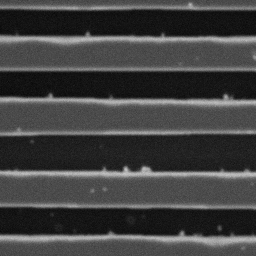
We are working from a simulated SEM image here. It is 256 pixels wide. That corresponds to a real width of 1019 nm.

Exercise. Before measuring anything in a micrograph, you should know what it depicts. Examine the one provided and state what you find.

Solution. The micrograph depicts lines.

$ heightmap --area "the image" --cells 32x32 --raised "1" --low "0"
11111111111111111111111111111111
00000000000000000000000000000000
00000000000000000000000000000000
00000000000000000000000000000000
00000000000000000000000000000000
11111111111111111111111111111111
11111111111111111111111111111111
11111111111111111111111111111111
11111111111111111111111111111111
00000000000000000000000000000000
00000000000000000000000000000000
00000000000000000000000000000000
11111111111111000000000000000000
11111111111111111111111111111111
11111111111111111111111111111111
11111111111111111111111111111111
11111111111111111111111111111111
00000000000000000000000000000000
00000000000000000000000000000000
00000000000000000000000000000000
00000000000000000000000000000000
11111100101110000000000000000000
11111111111111111111111111111111
11111111111111111111111111111111
11111111111111111111111111111111
11111111111111111111111111111111
00000000000000000000000000000000
00000000000000000000000000000000
00000000000000000000000000000000
11000000000001100000000000000000
11111111111111111111111111111111
11111111111111111111111111111111